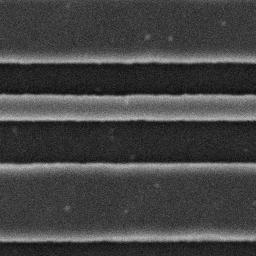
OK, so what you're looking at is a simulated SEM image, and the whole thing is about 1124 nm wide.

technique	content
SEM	lines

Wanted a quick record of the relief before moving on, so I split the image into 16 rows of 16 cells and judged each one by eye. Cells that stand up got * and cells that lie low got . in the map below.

****************
****************
****************
****************
................
................
................
................
................
................
****************
****************
****************
****************
****************
................